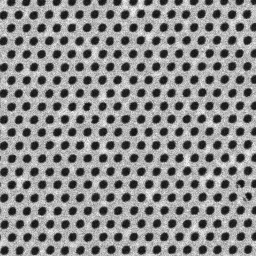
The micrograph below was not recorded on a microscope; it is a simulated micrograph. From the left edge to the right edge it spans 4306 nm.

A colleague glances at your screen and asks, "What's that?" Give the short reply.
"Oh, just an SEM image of a regular array of holes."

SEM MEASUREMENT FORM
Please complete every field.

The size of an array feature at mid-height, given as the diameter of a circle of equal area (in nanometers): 152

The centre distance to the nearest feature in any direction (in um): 0.247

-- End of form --